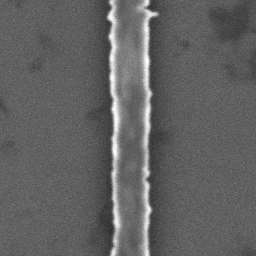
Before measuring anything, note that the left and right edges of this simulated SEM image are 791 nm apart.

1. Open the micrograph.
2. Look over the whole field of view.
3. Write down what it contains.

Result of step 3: one or a few lines or trenches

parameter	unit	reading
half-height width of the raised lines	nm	108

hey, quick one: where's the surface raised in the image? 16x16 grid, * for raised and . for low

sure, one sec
.......**.......
.......**.......
.......**.......
.......**.......
.......**.......
.......**.......
.......**.......
.......**.......
.......**.......
.......**.......
.......**.......
.......**.......
.......**.......
.......**.......
.......**.......
.......**.......